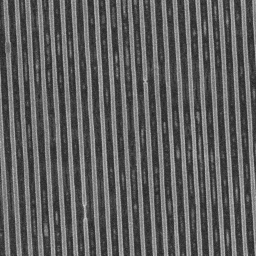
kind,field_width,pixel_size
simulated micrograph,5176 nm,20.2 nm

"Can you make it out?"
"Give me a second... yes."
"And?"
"parallel lines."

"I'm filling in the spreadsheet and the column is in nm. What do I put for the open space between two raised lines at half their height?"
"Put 154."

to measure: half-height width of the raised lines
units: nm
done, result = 75.7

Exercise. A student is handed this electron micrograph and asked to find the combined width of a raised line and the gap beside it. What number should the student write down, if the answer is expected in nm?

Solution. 228